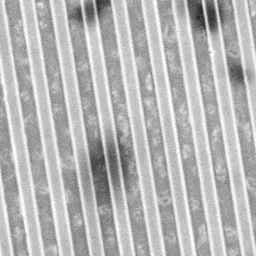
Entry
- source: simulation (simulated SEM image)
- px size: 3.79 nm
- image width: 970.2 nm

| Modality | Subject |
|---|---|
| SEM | parallel lines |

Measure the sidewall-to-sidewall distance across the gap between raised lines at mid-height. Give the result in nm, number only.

61.9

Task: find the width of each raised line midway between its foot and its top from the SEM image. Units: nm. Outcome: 51.1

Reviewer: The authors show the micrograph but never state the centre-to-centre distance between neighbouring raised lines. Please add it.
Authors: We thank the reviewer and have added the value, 0.114 um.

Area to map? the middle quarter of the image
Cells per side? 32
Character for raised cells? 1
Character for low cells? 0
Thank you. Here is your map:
11100001110000011100001110000011
11100001110000011100001111000011
11100001110000011100001111000011
11100001111000011100000111000011
11100001111000011110000111000011
11100000111000011110000111000011
11110000111000001110000111000001
11110000111000001110000111000001
01110000111000001110000111100001
01110000111100001110000011100001
01110000111100001110000011100001
01110000011100001111000011100001
01110000011100001111000011100000
01111000011100000111000011100000
00111000011100000111000011110000
00111000011100000111000011110000
00111000011110000111000001110000
00111000001110000111100001110000
00111000001110000111100001110000
00111100001110000011100001110000
00111100001110000011100001111000
00011100001110000011100001111000
00011100001111000011100000111000
00011100001111000011100000111000
00011100000111000011110000111000
00011110000111000001110000111000
00011110000111000001110000111000
00001110000111000001110000111100
00001110000111100001110000011100
00001110000111100001110000011100
00001110000011100001111000011100
00001110000011100001111000011100